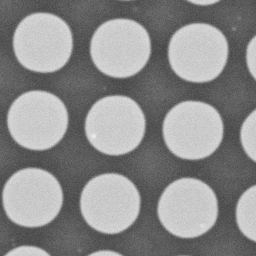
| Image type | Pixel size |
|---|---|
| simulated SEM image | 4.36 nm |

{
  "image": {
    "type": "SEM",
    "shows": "an array of small figures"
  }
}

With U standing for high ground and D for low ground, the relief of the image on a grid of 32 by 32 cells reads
DDDDDDDDDDDDDDDDDDDDDDDDUUDDDDDD
DDDDDDDDDDDDDDDDDDDDDDDDDDDDDDDD
DDDUUUUUDDDDDDUUDDDDDDDDDDDDDDDD
DDUUUUUUUDDDUUUUUUDDDDDUUUUDDDDD
DDUUUUUUUDDDUUUUUUUDDDUUUUUUDDDD
DDUUUUUUUDDUUUUUUUUDDUUUUUUUDDDU
DDUUUUUUUDDUUUUUUUUDDUUUUUUUDDDU
DDUUUUUUDDDDUUUUUUDDDUUUUUUUDDDU
DDDUUUUUDDDDUUUUUUDDDDUUUUUUDDDU
DDDDDDDDDDDDDDUUDDDDDDUUUUUDDDDD
DDDDDDDDDDDDDDDDDDDDDDDDDDDDDDDD
DDDDUUDDDDDDDDDDDDDDDDDDDDDDDDDD
DDUUUUUDDDDDDUUUDDDDDDDDDDDDDDDD
DUUUUUUUDDDUUUUUUDDDDDUUUUUDDDDD
DUUUUUUUDDDUUUUUUUDDDUUUUUUDDDDU
DUUUUUUUDDDUUUUUUUDDUUUUUUUUDDUU
DUUUUUUUDDDUUUUUUUDDUUUUUUUUDDUU
DDUUUUUDDDDUUUUUUUDDDUUUUUUUDDUU
DDDUUUDDDDDDUUUUUDDDDUUUUUUDDDUU
DDDDDDDDDDDDDDDDDDDDDDUUUUDDDDDU
DDDDDDDDDDDDDDDDDDDDDDDDDDDDDDDD
DDUUUUDDDDDDDDDDDDDDDDDDDDDDDDDD
DUUUUUUDDDDUUUUUDDDDDDUUUDDDDDDD
DUUUUUUUDDDUUUUUUDDDDUUUUUDDDDDU
UUUUUUUUDDUUUUUUUDDDUUUUUUUDDDUU
UUUUUUUUDDUUUUUUUDDDUUUUUUUDDDUU
DUUUUUUDDDUUUUUUUDDDUUUUUUUDDDUU
DUUUUUDDDDDUUUUUUDDDUUUUUUUDDDUU
DDDDDDDDDDDDUUUUDDDDDUUUUUDDDDUU
DDDDDDDDDDDDDDDDDDDDDDUUUDDDDDDU
DDDDDDDDDDDDDDDDDDDDDDDDDDDDDDDD
DUUUUUDDDDDDUUDDDDDDDDDDDDDDDDDD